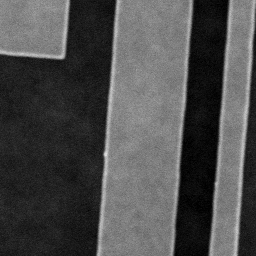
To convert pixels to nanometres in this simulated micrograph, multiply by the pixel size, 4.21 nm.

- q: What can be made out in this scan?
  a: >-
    groups of lines, slits or small figures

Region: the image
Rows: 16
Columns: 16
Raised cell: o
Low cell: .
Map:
oooo...ooooo..oo
oooo...ooooo..oo
oooo...ooooo..oo
..oo...ooooo..oo
.......ooooo..oo
.......ooooo..oo
.......ooooo..oo
.......oooo...o.
.......oooo...o.
.......oooo...o.
.......oooo...o.
......ooooo..oo.
......ooooo..oo.
......ooooo..oo.
......ooooo..oo.
......ooooo..oo.